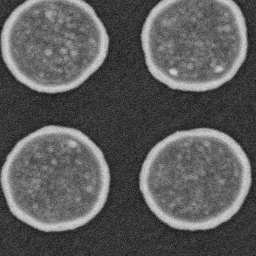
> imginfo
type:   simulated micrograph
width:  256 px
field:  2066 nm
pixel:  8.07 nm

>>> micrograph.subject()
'raised bodies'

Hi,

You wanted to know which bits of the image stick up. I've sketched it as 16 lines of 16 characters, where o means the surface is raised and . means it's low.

.ooooo....ooooo.
.ooooo...oooooo.
ooooooo..oooooo.
oooooo...oooooo.
.ooooo....ooooo.
..oo............
................
................
..ooo......ooo..
.ooooo....ooooo.
ooooooo..oooooo.
ooooooo..oooooo.
.ooooo...oooooo.
.ooooo....oooo..
................
................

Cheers